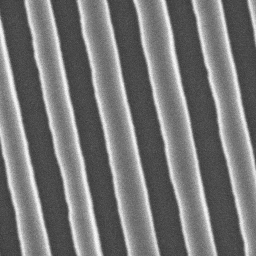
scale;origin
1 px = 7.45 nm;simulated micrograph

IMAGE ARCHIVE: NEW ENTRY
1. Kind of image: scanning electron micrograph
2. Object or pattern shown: lines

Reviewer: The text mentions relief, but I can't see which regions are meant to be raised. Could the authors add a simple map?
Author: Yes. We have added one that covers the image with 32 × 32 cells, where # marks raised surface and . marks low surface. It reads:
...###....###....####...####...#
...####...####...####...####...#
....###...####...####....###....
....###...####....###....###....
....###...####....####...###....
#...###....###....####...####...
#...####...####...####...####...
#....###...####...####....###...
#....###...####....###....###...
##...###....###....###....####..
##...###....###....####...####..
##...####...####...####....###..
##....###...####...####....###..
##....###...####....###....###..
###...###....###....####...###..
###...###....####...####...####.
###...####...####...####....###.
###....###...####....###....###.
###....###...####....###....###.
####...###....###....####...####
.###...###....####...####....###
.###....###...####...####....###
.###....###...####....###....###
.###....###...####....###....###
..###...###....###....####...###
..###....##....####...####....##
..###....###...####...####....##
..###....###...####....###....##
..####...###...####....###....##
..####...###....###....####...##
...###...###....####...####....#
...###....###...####....###....#